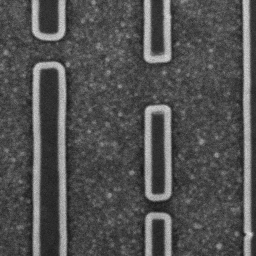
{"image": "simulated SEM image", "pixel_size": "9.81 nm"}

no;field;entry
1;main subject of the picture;one or a few lines or trenches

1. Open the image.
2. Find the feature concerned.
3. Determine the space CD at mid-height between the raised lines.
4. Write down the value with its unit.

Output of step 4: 795 nm